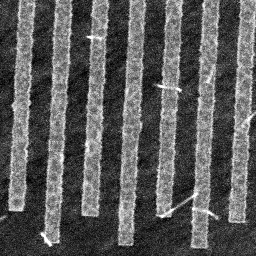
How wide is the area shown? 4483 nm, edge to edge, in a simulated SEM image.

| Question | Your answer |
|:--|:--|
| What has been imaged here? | parallel lines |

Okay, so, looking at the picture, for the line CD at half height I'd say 247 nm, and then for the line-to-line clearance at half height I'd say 391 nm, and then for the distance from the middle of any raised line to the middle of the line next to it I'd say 0.645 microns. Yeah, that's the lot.